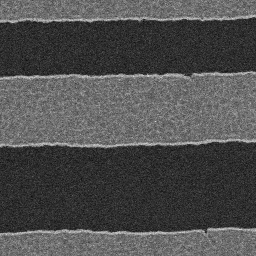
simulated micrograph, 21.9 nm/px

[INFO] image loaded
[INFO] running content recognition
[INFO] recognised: one or a few lines or trenches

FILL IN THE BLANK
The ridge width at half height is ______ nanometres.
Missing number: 1480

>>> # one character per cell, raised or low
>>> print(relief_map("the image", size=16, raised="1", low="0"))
1111111111111111
0000000000000000
0000000000000000
0000000000000000
0000000000000000
1111111111111111
1111111111111111
1111111111111111
1111111111111111
0000000000000000
0000000000000000
0000000000000000
0000000000000000
0000000000000000
0011110000011111
1111111111111111